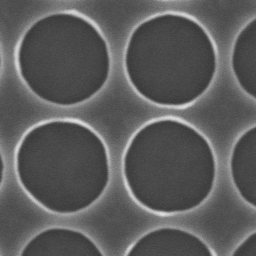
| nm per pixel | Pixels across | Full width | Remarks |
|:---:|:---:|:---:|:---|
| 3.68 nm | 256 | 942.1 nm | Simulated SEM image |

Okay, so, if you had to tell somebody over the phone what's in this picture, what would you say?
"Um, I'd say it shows holes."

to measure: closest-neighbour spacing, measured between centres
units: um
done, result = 0.392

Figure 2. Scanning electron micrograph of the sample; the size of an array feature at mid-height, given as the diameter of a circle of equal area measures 336 nm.